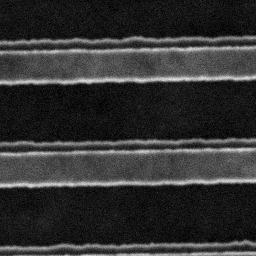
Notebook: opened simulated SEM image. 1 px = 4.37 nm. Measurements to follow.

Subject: lines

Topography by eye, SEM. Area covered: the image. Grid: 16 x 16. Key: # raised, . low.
................
................
................
################
################
................
................
................
................
....############
################
##########......
................
................
................
................